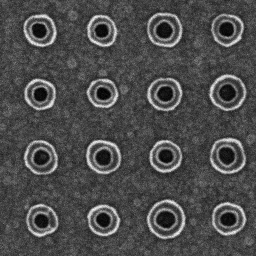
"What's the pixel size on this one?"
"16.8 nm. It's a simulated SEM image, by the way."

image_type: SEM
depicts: a regular array of ring-shaped raised bodies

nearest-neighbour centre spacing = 1040 nm